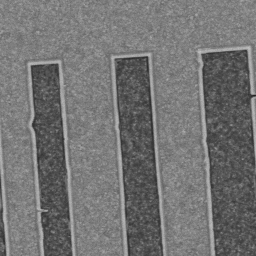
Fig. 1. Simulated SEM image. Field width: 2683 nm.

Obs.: one or a few lines or trenches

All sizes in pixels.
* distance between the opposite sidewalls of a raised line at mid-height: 49.6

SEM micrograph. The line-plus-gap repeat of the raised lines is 890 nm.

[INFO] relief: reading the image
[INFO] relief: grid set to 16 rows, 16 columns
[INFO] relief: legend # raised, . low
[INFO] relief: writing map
################
################
################
########.####...
##..###..####...
##..###...###...
##..###...###...
##..###...###...
##..###...###...
##..###...###...
##..####..###...
##..####..###...
##..####..###...
###.####..###...
###..###..###...
###..###..###...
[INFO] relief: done